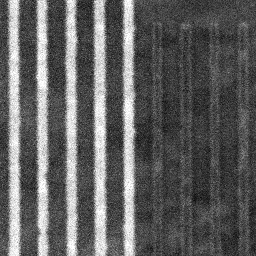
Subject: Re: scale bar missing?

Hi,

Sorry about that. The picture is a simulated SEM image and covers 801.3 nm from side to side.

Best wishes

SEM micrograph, parallel lines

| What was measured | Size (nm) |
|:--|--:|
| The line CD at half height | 23.1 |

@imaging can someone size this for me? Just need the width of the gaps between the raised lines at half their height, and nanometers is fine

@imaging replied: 66.1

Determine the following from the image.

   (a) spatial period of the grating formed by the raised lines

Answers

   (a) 89.7 nanometers